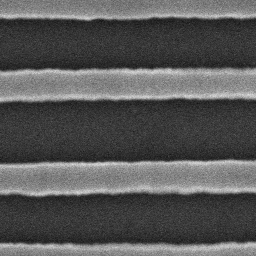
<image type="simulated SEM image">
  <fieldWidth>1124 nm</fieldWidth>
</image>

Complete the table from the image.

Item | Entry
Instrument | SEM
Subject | lines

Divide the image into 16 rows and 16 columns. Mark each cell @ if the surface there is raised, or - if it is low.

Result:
@@@@@@@@@@@@@@@@
----------------
----------------
----------------
-@@@@@@@@@@@@@@@
@@@@@@@@@@@@@@@@
----------------
----------------
----------------
----------------
@@@@@@@@@@@@@@@@
@@@@@@@@@@@@@@@@
----------------
----------------
----------------
@@@@@@@@@@@@@@@@